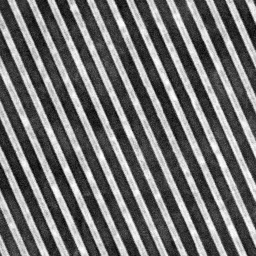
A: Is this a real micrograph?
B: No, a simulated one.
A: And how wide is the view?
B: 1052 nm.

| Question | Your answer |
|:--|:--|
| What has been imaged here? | parallel lines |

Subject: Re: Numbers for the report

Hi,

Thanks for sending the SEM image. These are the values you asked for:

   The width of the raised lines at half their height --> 21.6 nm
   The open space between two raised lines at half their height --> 0.0498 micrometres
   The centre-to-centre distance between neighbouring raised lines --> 74.4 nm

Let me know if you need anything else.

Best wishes